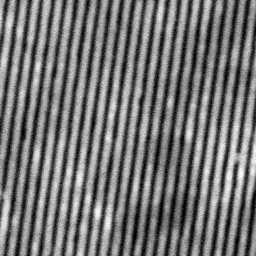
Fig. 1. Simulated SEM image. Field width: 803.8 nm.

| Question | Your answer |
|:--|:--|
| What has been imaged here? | parallel lines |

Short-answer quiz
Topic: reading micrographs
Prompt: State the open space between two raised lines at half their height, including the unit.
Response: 14.7 nanometers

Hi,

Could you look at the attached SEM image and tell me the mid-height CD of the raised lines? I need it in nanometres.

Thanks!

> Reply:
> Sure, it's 20.5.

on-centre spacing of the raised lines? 35.7 nm